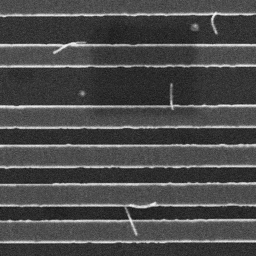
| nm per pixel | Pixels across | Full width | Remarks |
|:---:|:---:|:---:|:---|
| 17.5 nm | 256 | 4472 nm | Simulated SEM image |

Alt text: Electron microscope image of lines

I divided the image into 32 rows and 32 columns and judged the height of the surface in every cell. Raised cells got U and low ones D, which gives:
UUUUUUUUUUUUUUUUUUUUUUUUUUUUUUUU
UUUUUUUUUUUUUUUUUUUUUUUUUUUUUUUU
DDDDDDDDDDDDDDDDDDDDDDDDDDDDDDDD
DDDDDDDDDDDDDDDDDDDDDDDDDDDDDDDD
DDDDDDDDDDDDDDDDDDDDDDDDDDDDDDDD
DDDDDDDDUUDDDDDDDDDDDDDDDDDDDDDD
UUUUUUUUUUUUUUUUUUUUUUUUUUUUUUUU
UUUUUUUUUUUUUUUUUUUUUUUUUUUUUUUU
DDDDDDDDDDDDDDDDDDDDDDDDDDDDDDDD
DDDDDDDDDDDDDDDDDDDDDDDDDDDDDDDD
DDDDDDDDDDDDDDDDDDDDDDDDDDDDDDDD
DDDDDDDDDDDDDDDDDDDDDDDDDDDDDDDD
DDDDDDDDDDDDDDDDDDDDDDDDDDDDDDDD
UUUUUUUUUUUUUUUUUUUUUUUUUUUUUUUU
UUUUUUUUUUUUUUUUUUUUUUUUUUUUUUUU
UUUUUUUUUUUUUUUUUUUUUUUUUUUUUUUU
DDDDDDDDDDDDDDDDDDDDDDDDDDDDDDDD
DDDDDDDDDDDDDDDDDDDDDDDDDDDDDDDD
UUUUUUUUUUUUUUUUUUUUUUUUUUUUUUUU
UUUUUUUUUUUUUUUUUUUUUUUUUUUUUUUU
UUUUUUUUUUUUUUUUUUUUUUUUUUUUUUUU
DDDDDDDDDDDDDDDDDDDDDDDDDDDDDDDD
DDDDDDDDDDDDDDDDDDDDDDDDDDDDDDDD
UUUUUUUUUUUUUUUUUUUUUUUUUUUUUUUU
UUUUUUUUUUUUUUUUUUUUUUUUUUUUUUUU
UUUUUUUUUUUUUUUUUUUUUUUUUUUUUUUU
DDDDDDDDDDDDDDDDDDDDDDDDDDDDDDDD
DDDDDDDDDDDDDDDDUDDDUDDDUUUUUUUU
UUUUUUUUUUUUUUUUUUUUUUUUUUUUUUUU
UUUUUUUUUUUUUUUUUUUUUUUUUUUUUUUU
DDDDDDDDDDDDDDDDDDDDDDDDDDDDDDDD
DDDDDDDDDDDDDDDDDDDDDDDDDDDDDDDD